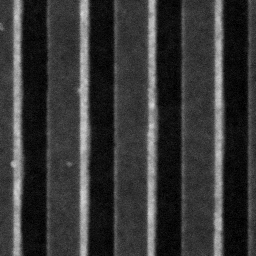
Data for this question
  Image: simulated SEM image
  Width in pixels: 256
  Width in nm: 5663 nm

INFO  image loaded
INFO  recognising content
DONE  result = lines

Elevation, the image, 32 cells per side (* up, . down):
***...*****....****....*****...*
***...*****....****....*****...*
***...*****....****....*****...*
***...*****....****....*****...*
**....*****....****....*****...*
**....*****....****....*****...*
**....*****....****....*****...*
**....*****....****....*****...*
**....*****...*****....*****...*
**....*****...*****....*****...*
**....*****...*****....*****...*
**....*****...*****....*****...*
**....*****...*****....*****...*
**....*****...*****....*****...*
**....*****...*****....*****...*
**....*****...*****....*****...*
**....*****...*****....*****...*
**....*****...*****....*****...*
**....*****...*****....*****...*
***...*****...*****....*****...*
***...*****...*****....*****...*
***...*****...*****....*****...*
***...*****...*****....*****...*
**....*****...*****....*****...*
**....*****...*****....*****...*
**....*****...*****....*****...*
**....*****...*****....*****...*
**....*****...*****....*****...*
**....*****...*****....*****...*
**....*****...*****....*****...*
**....*****...*****....*****...*
**....*****...*****....*****...*